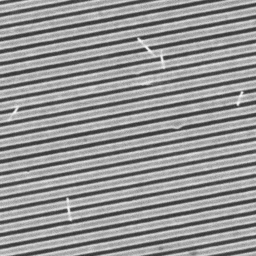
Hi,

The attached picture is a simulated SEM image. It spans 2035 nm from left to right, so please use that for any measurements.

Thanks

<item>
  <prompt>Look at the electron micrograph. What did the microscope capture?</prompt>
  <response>parallel lines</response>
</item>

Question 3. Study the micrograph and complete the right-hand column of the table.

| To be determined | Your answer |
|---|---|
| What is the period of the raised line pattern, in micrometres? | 0.0955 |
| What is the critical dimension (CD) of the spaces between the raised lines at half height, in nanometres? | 40.1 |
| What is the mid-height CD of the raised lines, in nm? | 54.7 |